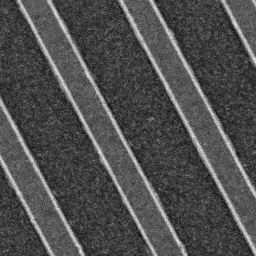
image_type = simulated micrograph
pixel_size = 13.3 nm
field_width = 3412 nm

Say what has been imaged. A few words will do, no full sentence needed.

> one or a few lines or trenches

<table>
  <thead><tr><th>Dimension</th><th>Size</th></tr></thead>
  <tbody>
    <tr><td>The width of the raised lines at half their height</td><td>355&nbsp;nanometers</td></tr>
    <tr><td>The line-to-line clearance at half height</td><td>847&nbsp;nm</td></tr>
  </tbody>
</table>